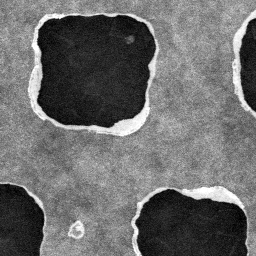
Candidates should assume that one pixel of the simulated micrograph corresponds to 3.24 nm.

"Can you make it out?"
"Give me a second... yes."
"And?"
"holes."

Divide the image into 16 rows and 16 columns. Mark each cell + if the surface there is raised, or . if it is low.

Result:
++++++++++++++++
+++......+++++++
++........+++++.
++........+++++.
++........+++++.
++.......++++++.
++.......++++++.
+++.....++++++++
++++++++++++++++
++++++++++++++++
++++++++++++++++
.+++++++++++++++
..+++++++.....++
...++++++......+
...++++++......+
...++++++......+